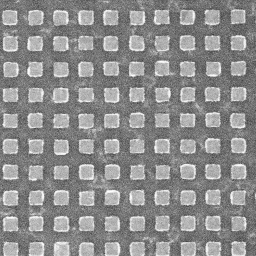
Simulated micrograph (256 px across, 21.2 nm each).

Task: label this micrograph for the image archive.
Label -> a regular array of raised bodies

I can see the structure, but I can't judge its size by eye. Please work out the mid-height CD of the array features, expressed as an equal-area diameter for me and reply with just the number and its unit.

321 nm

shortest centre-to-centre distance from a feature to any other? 533 nm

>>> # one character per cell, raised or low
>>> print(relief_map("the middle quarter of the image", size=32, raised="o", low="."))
o...ooo...ooo....ooo...ooo...ooo
o...ooo...ooo....ooo...ooo...ooo
o...ooo...ooo....ooo...ooo...ooo
................................
................................
................................
o...ooo...oooo...ooo...ooo...ooo
o...ooo...oooo...ooo...ooo...ooo
o...ooo...oooo...ooo...ooo...ooo
................................
................................
................................
.................ooo............
o...ooo...oooo...ooo...ooo...ooo
o...ooo...oooo...ooo...ooo...ooo
o...ooo...ooo....ooo...ooo...ooo
................................
................................
................................
o...ooo...oooo...ooo...ooo...ooo
o...ooo...oooo...ooo...ooo...ooo
o...ooo...oooo...ooo...ooo...ooo
................................
................................
................................
....ooo....oo.................oo
o...ooo...oooo...ooo...ooo...ooo
o...ooo...oooo...ooo...ooo...ooo
o...ooo....oo....ooo...ooo....oo
................................
................................
................................